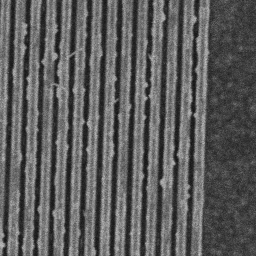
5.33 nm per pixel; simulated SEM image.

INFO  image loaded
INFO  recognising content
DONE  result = parallel lines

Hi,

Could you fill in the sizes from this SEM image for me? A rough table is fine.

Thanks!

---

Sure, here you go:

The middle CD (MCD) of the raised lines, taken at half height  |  45.3 nm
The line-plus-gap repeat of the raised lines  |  81.4 nm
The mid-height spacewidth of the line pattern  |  36 nm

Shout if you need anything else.